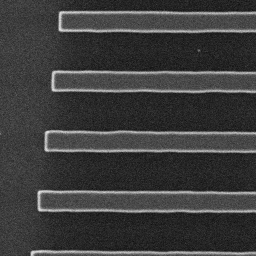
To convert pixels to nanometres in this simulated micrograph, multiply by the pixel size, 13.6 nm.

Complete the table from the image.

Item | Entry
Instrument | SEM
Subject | groups of lines, slits or small figures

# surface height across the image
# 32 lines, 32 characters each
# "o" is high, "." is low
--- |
................................
...............oo...............
.......ooooooooooooooooooooooooo
.......ooooooooooooooooooooooooo
................................
................................
................................
................................
................................
.......ooooooooooooooooooooooooo
.......ooooooooooooooooooooooooo
................................
................................
................................
................................
................................
......oo......ooo...............
......oooooooooooooooooooooooooo
......oooooooooooooooooooooooooo
................................
................................
................................
................................
................................
.....ooooooooooooooooooooooooooo
.....ooooooooooooooooooooooooooo
........................o..o.oo.
................................
................................
................................
................................
....oooooooooooooooo.oo.........